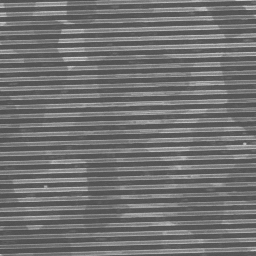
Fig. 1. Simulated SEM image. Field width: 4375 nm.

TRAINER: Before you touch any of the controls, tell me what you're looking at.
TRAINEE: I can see parallel lines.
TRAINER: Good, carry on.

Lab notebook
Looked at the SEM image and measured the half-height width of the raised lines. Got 70.5 nm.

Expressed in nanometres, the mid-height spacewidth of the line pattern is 93.9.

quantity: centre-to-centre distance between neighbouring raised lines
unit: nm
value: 159